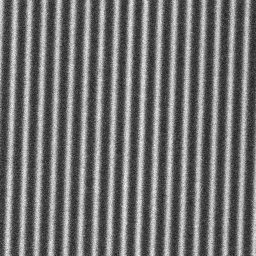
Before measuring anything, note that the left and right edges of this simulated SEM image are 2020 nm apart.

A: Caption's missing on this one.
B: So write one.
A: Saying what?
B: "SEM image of parallel lines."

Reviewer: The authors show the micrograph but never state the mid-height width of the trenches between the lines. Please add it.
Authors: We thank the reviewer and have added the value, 94.6 nm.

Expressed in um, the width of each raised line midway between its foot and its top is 0.0207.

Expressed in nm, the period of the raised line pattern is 114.